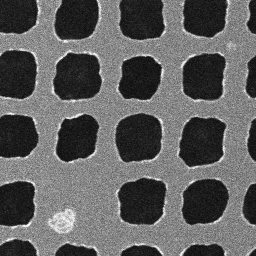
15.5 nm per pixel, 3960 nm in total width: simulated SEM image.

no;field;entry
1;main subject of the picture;a regular array of holes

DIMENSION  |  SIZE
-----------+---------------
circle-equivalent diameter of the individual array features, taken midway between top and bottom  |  747 nm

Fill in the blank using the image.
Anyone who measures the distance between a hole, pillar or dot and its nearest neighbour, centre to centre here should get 937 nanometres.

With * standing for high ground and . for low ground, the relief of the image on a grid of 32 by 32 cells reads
.....***....***.....***.....***.
.....**.....***.....***.....***.
.....**.....***.....***.....***.
....***.....***......**.....***.
*******....*****....*****..*****
********************************
*...****************************
....****....****...*****....***.
.....**.....***.....***.....***.
.....**......**.....***.....***.
....***......**.....***.....***.
....***.....***....****.....***.
********.********..*******.*****
********************************
...*******.*****...*************
....****....***.....***.....***.
.....**.....**......***.....***.
.....**.....**......***.....***.
....***.....***.....**......***.
...****....****.....**......***.
***********************...******
********************************
*****************...*****..*****
....***********......**.....***.
....***********......**......**.
....***********......**.....**..
....***********.....***.....**..
....***********.....***....****.
********************************
********************************
....****.***********************
.....**.....***.....***.....***.